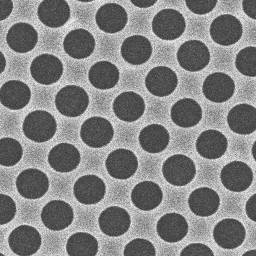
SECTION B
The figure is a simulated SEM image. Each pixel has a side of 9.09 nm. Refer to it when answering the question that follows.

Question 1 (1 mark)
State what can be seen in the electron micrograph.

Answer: a regular array of holes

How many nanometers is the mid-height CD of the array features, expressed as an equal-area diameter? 289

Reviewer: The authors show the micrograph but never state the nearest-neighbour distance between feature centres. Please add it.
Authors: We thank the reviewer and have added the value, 365 nm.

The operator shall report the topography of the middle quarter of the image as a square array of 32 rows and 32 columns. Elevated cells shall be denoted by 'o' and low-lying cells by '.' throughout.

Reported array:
ooooooo......ooooooooooo.oooo...
oooooo........oooooooo.....ooo..
oooooo........ooooooo.......oooo
oooooo........oooooo........oooo
oooooo........oooooo........oooo
....ooo......ooooooo........oooo
.....oooooooooooooooo.......oooo
......oooooooo.....ooo.....ooooo
......ooooooo.......oooooooooo.o
......oooooo........oooooooo....
......oooooo........ooooooo.....
.....ooooooo........ooooooo.....
.....oooooooo.......ooooooo.....
oooooo....oooo.....oooooooo.....
ooooo.......oooo.oooooooooo.....
oooo........ooooooooo....ooo....
oooo........ooooooo.......oooooo
oooo.........oooooo.......oooooo
oooo........oooooo........oooooo
ooooo.......ooooooo.......oooooo
...ooo....ooooooooo.......oooooo
....ooooooooo....ooo.....ooooooo
....ooooooo.......oooooooooooooo
....ooooooo.......oooooooo.....o
....oooooo.........oooooo.......
...ooooooo.........oooooo.......
..ooooooooo.......oooooo........
ooooooooooo.......ooooooo.......
oooo.....ooo....ooooooooo.......
ooo.......ooooooooo....ooo......
oo........oooooooo......oooo..oo
oo.........oooooo.......oooooooo